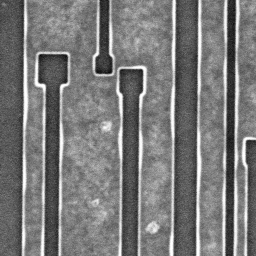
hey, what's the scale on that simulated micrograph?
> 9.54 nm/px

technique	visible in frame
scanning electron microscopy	groups of lines, slits or small figures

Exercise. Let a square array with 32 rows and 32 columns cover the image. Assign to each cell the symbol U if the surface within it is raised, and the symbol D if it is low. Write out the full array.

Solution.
DDDUUUUUUUUUDDUUUUUUUUDDDUUUDDUU
DDDUUUUUUUUUDDUUUUUUUUDDDUUUDDUU
DDDUUUUUUUUUDDUUUUUUUUDDDUUUDDUU
DDDUUUUUUUUUDDUUUUUUUUDDDUUUDDUU
DDDUUUUUUUUUDDUUUUUUUUDDDUUUDDUU
DDDUUUUUUUUUDDUUUUUUUUDDDUUUDDUU
DDDUUUUUUUUUDDUUUUUUUUDDDUUUDDUU
DDDUUDDDDUUUDDUUUUUUUUDDDUUUDDUU
DDDUUDDDDUUUDDUUDDUUUUDDDUUUDDUU
DDDUUDDDDUUUUUUDDDUUUUDDDUUUDDUU
DDDUUDDDUUUUUUUDDDUUUUDDDUUUDDUU
DDDUUUDDUUUUUUUDDDUUUUDDDUUUDDUU
DDDUUUDDUUUUUUUDDDUUUUDDDUUUDDUU
DDDUUUDDUUUUUUUDDDUUUUDDDUUUDDUU
DDDUUUDDUUUUUUUDDDUUUUDDDUUUDDUU
DDDUUUDDUUUUUUUDDDUUUUDDDUUUDDUU
DDDUUUDDUUUUUUUDDDUUUUDDDUUUDDUU
DDDUUUDDUUUUUUUDDDUUUUDDDUUUDDUD
DDDUUUDDUUUUUUUDDDUUUUDDDUUUDDDD
DDDUUUDDUUUUUUUDDDUUUUDDDUUUDDDD
DDDUUUDDUUUUUUUDDUUUUUDDDUUUDDUD
DDDUUUDDUUUUUUUDDUUUUUDDDUUUDUUD
DDDUUUDDUUUUUUUDDUUUUUDDDUUUDUUD
DDDUUDDDUUUUUUUDDUUUUUDDDUUUDDUD
DDDUUDDDUUUUUUUDDUUUUUDDDUUUDDUD
DDDUUDDDUUUUUUUDDUUUUUDDDUUUDDUD
DDDUUDDDUUUUUUUDDUUUUUDDDUUUDDUD
DDDUUDDDUUUUUUUDDUUUUUDDDUUUDDUD
DDDUUDDDUUUUUUUDDUUUUUDDDUUUDDUD
DDDUUDDDUUUUUUUDDUUUUUDDDUUUDDUD
DDDUUDDUUUUUUUUDDUUUUUDDDUUUDUUD
DDDUUDDUUUUUUUUDDUUUUDDDDUUUDUUD